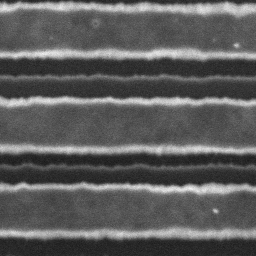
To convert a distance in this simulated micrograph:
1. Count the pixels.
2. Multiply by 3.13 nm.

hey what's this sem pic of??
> lines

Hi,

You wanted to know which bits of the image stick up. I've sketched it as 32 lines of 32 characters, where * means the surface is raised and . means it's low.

*.**********.....**.........*...
********************************
********************************
********************************
********************************
********************************
********************************
................................
................................
................................
................................
................................
************************.*****..
********************************
********************************
********************************
********************************
********************************
********************************
................................
................................
................................
................................
********************************
********************************
********************************
********************************
********************************
********************************
*.******************************
................................
................................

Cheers